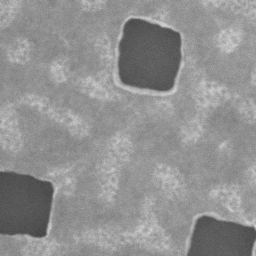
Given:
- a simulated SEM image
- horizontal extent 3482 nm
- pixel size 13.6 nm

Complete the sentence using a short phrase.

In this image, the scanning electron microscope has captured holes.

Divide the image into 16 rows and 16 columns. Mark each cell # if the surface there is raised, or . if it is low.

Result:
################
########..######
########...#####
#######....#####
#######....#####
########...#####
################
################
################
################
################
...#############
...#############
...#############
...#########....
############....